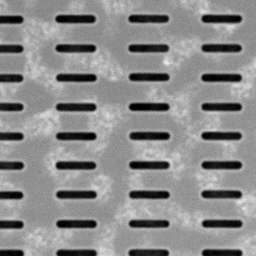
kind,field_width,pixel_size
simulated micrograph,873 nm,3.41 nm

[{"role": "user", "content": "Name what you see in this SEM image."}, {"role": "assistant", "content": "a regular array of holes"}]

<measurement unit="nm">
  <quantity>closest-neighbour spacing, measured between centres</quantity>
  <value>98.9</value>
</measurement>